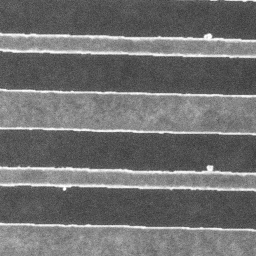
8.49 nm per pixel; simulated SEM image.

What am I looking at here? lines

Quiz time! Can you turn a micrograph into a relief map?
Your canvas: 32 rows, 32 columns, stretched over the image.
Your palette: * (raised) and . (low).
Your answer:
................................
................................
................................
................................
******.**.......................
********************************
........************************
................................
................................
................................
................................
*********.......................
********************************
********************************
********************************
********************************
...................*************
................................
................................
................................
................................
*****************.**..**..*.....
********************************
..................*.************
................................
................................
................................
................................
************************.*......
********************************
********************************
********************************